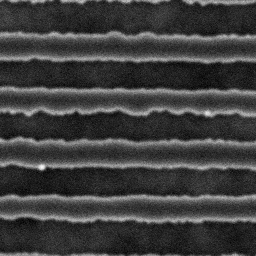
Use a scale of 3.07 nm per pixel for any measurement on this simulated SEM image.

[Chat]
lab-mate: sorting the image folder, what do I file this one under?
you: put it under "lines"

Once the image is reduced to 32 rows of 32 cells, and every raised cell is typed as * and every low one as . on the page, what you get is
................................
................................
................................
................................
***********************.*..*****
********************************
********************************
.......*.......******..*********
................................
................................
................................
********************************
********************************
********************************
................................
................................
................................
****.........**.................
********************************
********************************
********************************
................................
................................
................................
.*....*..........*.............*
********************************
********************************
........****.***.***************
................................
................................
................................
................................